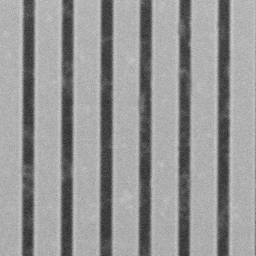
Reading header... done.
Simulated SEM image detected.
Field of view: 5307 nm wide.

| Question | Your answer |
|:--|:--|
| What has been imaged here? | parallel lines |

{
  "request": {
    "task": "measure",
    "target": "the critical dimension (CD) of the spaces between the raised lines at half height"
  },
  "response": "316 nanometers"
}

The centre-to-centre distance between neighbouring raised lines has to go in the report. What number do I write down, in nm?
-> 809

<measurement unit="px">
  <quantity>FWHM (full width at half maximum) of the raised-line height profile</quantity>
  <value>23.6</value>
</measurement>